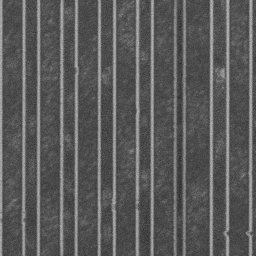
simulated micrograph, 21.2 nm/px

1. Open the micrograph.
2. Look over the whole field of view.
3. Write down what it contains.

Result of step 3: parallel lines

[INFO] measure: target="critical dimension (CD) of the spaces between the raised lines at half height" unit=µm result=0.308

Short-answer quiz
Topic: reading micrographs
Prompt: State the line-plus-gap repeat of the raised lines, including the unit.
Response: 801 nm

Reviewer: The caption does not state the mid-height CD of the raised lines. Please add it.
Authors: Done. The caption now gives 491 nanometres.